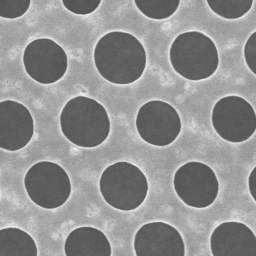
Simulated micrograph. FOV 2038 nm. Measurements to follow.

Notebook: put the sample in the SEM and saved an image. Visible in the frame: a regular array of holes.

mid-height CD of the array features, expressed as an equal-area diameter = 377 nm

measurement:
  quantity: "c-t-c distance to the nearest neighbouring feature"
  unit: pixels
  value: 72.7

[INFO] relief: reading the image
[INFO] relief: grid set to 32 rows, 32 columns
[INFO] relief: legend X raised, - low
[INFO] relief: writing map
----XXXX----XXXXX-----XXXX------
---XXXXXX---XXXXXX----XXXXX----X
XXXXXXXXXXXXXXXXXXXXXXXXXXXXXXXX
XXXXXXXXXXXXXXXXXXXXXXXXXXXXXXXX
XXXXXXXXXXXXX----XXXXX----XXXXX-
XXXX---XXXXX------XXXX-----XXXX-
XXX-----XXXX------XXX------XXX--
XXX-----XXXX------XXX------XXXX-
XXX-----XXXX------XXXX-----XXXX-
XXXX----XXXXX----XXXXXX---XXXXXX
XXXXXXXXXXXXXXXXXXXXXXXXXXXXXXXX
XXXXXXXXXXXXXXXXXXXXXXXXXXXXXXXX
XXXXXXXXX---XXXXXXXXXXXXXXX----X
---XXXXX-----XXXXX----XXXXX-----
----XXXX-----XXXX-----XXXXX-----
----XXXX------XXX------XXXX-----
----XXXX------XXX-----XXXXX-----
----XXXXX----XXXXX----XXXXXX---X
---XXXXXXXXXXXXXXXXXXXXXXXXXXXXX
XXXXXXXXXXXXXXXXXXXXXXXXXXXXXXXX
XXXX---XXXXXXX--XXXXXXX---XXXXXX
XXX-----XXXXX-----XXXX-----XXXX-
XXX------XXXX-----XXXX-----XXXX-
XXX------XXXX-----XXXX-----XXXX-
XXXX-----XXXX-----XXXX-----XXXX-
XXXXX---XXXXXX----XXXXX---XXXXXX
XXXXXXXXXXXXXXXXXXXXXXXXXXXXXXXX
XXXXXXXXXXXXXXXXXXXXXXXXXXXXXXXX
X-XXXXXXXX--XXXXXX----XXXXX----X
----XXXX-----XXXX------XXX------
----XXXX------XXX------XXX------
-----XXX------XXX------XXX------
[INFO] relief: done